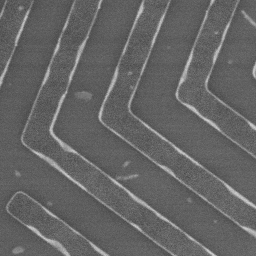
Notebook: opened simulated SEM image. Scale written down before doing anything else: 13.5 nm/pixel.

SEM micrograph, groups of lines, slits or small figures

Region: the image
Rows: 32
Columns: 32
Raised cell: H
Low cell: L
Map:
LHHHLLLLLHHHLLLLLLHHHLLLLLHHHHLL
HHHHLLLLLHHHLLLLLLHHHLLLLLHHHLLL
HHHLLLLLHHHHLLLLLHHHLLLLLLHHHLLL
HHHLLLLLHHHLLLLLLHHHLLLLLHHHLLLL
HHLLLLLLHHHLLLLLHHHLLLLLLHHHLLLL
HHLLLLLHHHLLLLLLHHHLLLLLHHHHLLLL
HHLLLLLHHHLLLLLHHHHLLLLLHHHLLLLL
HLLLLLHHHHLLLLLHHHLLLLLLHHHLLLLL
HLLLLLHHHLLLLLLHHHLLLLLHHHHLLLLL
LLLLLLHHHLLLLLHHHHLLLLLHHHLLLLLL
LLLLLHHHHLLLLLHHHLLLLLHHHHLLLLLL
LLLLLHHHLLLLLLHHHLLLLLHHHHLLLLLL
LLLLHHHHLLLLLHHHLLLLLLHHHHHLLLLL
LLLLHHHLLLLLLHHHLLLLLLLLHHHHHLLL
LLLLHHHLLLLLLHHHHLLLLLLLLHHHHHLL
LLLHHHHLLLLLLHHHHHLLLLLLLLLHHHHL
LLLHHHHLLLLLLLHHHHHLLLLLLLLLHHHH
LLLHHHHLLLLLLLLLHHHHHLLLLLLLLHHH
LLLLHHHHLLLLLLLLLHHHHHLLLLLLLLHH
LLLLLHHHHHLLLLLLLLHHHHHLLLLLLLLL
LLLLLLLHHHHLLLLLLLLLHHHHHLLLLLLL
LLLLLLLLHHHHHLLLLLLLLHHHHHLLLLLL
LLLLLLLLLHHHHHLLLLLLLLHHHHHHLLLL
LLLLLLLLLLHHHHHLLLLLLLLLHHHHHLLL
LLHHLLLLLLLLHHHHHLLLLLLLLHHHHHLL
LHHHHLLLLLLLLHHHHHLLLLLLLLHHHHHL
LHHHHHLLLLLLLLHHHHHLLLLLLLLLHHHH
LLHHHHHLLLLLLLLLHHHHHLLLLLLLLHHH
LLLLHHHHHLLLLLLLLHHHHHLLLLLLLLLH
LLLLLHHHHHLLLLLLLLHHHHHHLLLLLLLL
LLLLLLLHHHHLLLLLLLLLHHHHHLLLLLLL
LLLLLLLLHHHHHLLLLLLLLHHHHHLLLLLL